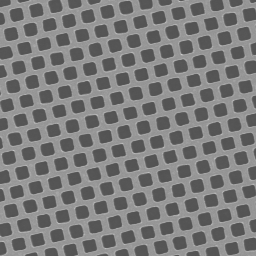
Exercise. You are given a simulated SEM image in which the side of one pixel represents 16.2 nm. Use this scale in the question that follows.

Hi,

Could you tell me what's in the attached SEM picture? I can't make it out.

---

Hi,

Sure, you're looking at a regular array of holes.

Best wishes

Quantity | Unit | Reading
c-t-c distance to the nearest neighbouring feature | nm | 315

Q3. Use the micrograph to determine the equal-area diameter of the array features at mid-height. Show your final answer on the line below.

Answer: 0.229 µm